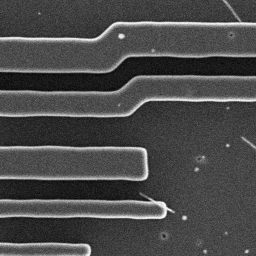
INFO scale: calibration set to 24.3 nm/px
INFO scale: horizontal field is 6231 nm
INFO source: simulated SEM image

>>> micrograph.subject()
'groups of lines, slits or small figures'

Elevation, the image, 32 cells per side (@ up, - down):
--------------------------------
--------------------------------
--------------------------------
--------------@@@@@@@@@@@@@@@@@@
-------------@@@@@@@@@@@@@@@@@@@
@@@@@@@@@@@@@@@@@@@@@@@@@@@@@@@@
@@@@@@@@@@@@@@@@@@@@@@@@@@@@@@@@
@@@@@@@@@@@@@@@-----------------
@@@@@@@@@@@@@@------------------
--------------------------------
----------------@@@@@@@@@@@@@@@@
@@@@@---------@@@@@@@@@@@@@@@@@@
@@@@@@@@@@@@@@@@@@@-------------
@@@@@@@@@@@@@@@@@---------------
--------------------------------
--------------------------------
--------------------------------
--------------------------------
@@@@@@@@@-----------------------
@@@@@@@@@@@@@@@@@@--------------
@@@@@@@@@@@@@@@@@@--------------
@@@@@@@@@@@@@@@@@@--------------
--------------------------------
--------------------------------
--------------------------------
@@@@@@@@@@@@@@@@@@@@------------
@@@@@@@@@@@@@@@@@@@@@-----------
--------------------------------
--------------------------------
--------------------------------
@-------------------------------
@@@@@@@@@@@---------------------